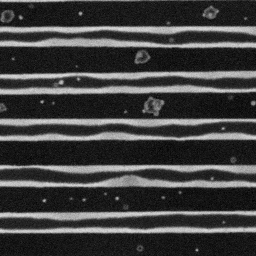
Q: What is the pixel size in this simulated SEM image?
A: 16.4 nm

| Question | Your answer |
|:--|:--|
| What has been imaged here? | lines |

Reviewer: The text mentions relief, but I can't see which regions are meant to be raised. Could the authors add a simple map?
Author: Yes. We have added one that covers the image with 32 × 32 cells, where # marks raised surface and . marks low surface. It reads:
................................
................................
................................
................................
################################
######........##################
................................
................................
................................
....############################
################################
###.............................
................................
................................
................................
################################
################################
................................
................................
................................
................................
################################
################################
................................
................................
................................
................................
################################
################################
................................
................................
................................